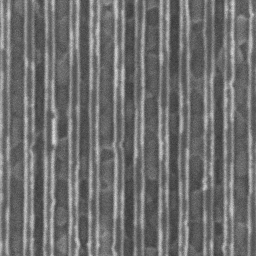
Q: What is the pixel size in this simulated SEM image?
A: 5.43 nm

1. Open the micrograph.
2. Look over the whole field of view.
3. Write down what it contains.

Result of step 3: parallel lines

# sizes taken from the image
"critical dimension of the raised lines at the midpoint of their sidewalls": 0.0475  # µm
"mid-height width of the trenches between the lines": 0.0848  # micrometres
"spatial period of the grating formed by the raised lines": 121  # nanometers